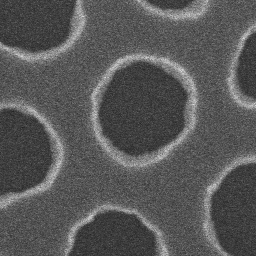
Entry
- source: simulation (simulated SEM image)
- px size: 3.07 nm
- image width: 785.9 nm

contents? holes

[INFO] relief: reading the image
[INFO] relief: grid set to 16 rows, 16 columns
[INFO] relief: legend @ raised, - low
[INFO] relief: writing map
-----@@@@@--@@@@
-----@@@@@@@@@@@
----@@@@@@@@@@@-
@@@@@@@@@@@@@@@-
@@@@@@@----@@@@-
@@@@@@------@@@-
@@@@@@------@@@@
--@@@@------@@@@
---@@@-----@@@@@
----@@@---@@@@@@
---@@@@@@@@@@@@-
--@@@@@@@@@@@@--
@@@@@@@@@@@@@---
@@@@@@--@@@@@---
@@@@@----@@@@---
@@@@------@@@@--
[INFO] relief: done